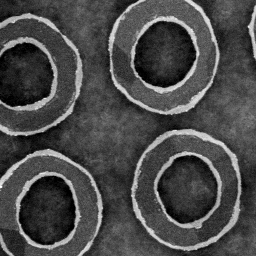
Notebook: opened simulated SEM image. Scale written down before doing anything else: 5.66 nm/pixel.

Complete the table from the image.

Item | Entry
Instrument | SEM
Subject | ring-shaped raised bodies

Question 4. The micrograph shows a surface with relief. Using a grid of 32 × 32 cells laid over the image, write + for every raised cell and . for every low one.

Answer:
.................+++++++........
................+++++++++.......
.+++++.........+++++..++++......
+++++++.......++++.....+++.....+
++++++++......+++.......+++....+
++...++++.....+++.......+++.....
......++++....+++........++.....
......++++....+++........++.....
.......+++....+++.......+++.....
.......+++....+++......++++.....
.......+++....++++....++++......
.......+++......++++++++++......
......+++........++++++++.......
+++++++++.........+++++.........
++++++++........................
+++++++.........................
.++++.................++........
....................++++++......
...................+++++++++....
....++++..........+++++..++++...
..+++++++........++++.....+++...
.++++++++++......+++.......+++..
++++....++++.....+++.......+++..
+++......+++.....+++.......+++..
+++......+++.....+++.......+++..
++.......++++....+++.......+++..
++........+++....++++.....++++..
++........+++.....++++...++++...
+++......+++......++++++++++....
+++......+++.......++++++++.....
++++...++++..........+++++......
.+++++++++......................